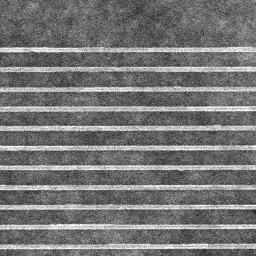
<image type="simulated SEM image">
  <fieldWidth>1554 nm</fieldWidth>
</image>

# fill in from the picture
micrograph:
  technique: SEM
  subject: parallel lines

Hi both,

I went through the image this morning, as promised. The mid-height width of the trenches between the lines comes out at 0.094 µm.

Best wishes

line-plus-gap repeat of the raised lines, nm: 120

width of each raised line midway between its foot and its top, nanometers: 25.8